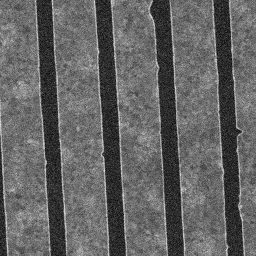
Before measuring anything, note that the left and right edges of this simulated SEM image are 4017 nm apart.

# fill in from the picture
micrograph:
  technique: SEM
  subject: parallel lines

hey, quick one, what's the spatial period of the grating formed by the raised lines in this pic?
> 922 nanometers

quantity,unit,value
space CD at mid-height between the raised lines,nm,270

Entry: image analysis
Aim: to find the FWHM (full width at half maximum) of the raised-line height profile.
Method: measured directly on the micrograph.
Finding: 0.658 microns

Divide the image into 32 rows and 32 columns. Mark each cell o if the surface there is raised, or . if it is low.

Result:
oooo...ooooo..ooooo..oooooo..ooo
oooo...ooooo..ooooo..oooooo..ooo
ooooo..ooooo..ooooo...ooooo..ooo
ooooo..ooooo..ooooo...ooooo..ooo
ooooo..ooooo..ooooo...ooooo..ooo
ooooo..ooooo..ooooo...ooooo..ooo
ooooo..ooooo..ooooo...ooooo..ooo
ooooo..ooooo..oooooo..ooooo..ooo
ooooo..ooooo...ooooo..ooooo..ooo
ooooo..ooooo...ooooo..ooooo..ooo
ooooo..ooooo...ooooo..ooooo..ooo
ooooo..ooooo...oooo...ooooo..oo.
ooooo..ooooo...ooooo..ooooo..ooo
ooooo..oooooo..ooooo..ooooo..ooo
ooooo..oooooo..ooooo..ooooo...oo
ooooo..oooooo..ooooo..ooooo...oo
ooooo..oooooo..ooooo..oooooo..oo
ooooo...ooooo..ooooo..oooooo..oo
oooooo..ooooo..ooooo..oooooo..oo
oooooo..ooooo..ooooo..oooooo..oo
oooooo..ooooo..ooooo..oooooo..oo
oooooo..ooooo..ooooo...ooooo..oo
oooooo..ooooo..ooooo...ooooo..oo
.ooooo..ooooo..ooooo...ooooo..oo
.ooooo..ooooo..ooooo...ooooo..oo
.ooooo..ooooo..oooooo..ooooo..oo
.ooooo..ooooo...ooooo..ooooo..oo
.ooooo..ooooo...ooooo..ooooo..oo
.ooooo..ooooo...ooooo..ooooo..oo
.ooooo..ooooo...ooooo..ooooo..oo
.ooooo..ooooo...ooooo..ooooo...o
.ooooo..oooooo..ooooo..ooooo...o